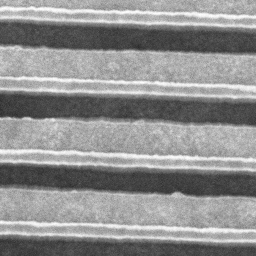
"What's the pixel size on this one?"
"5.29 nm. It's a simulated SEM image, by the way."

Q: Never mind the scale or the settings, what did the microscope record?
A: lines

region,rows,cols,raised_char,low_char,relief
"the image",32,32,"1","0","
11111111111111111111111111111111
11111111111111111111111111111111
00000011111111111111111111111111
00000000000000000000000000000000
00000000000000000000000000000000
00000000000000000000000000000000
11111111111111111110000000000000
11111111111111111111111111111111
11111111111111111111111111111111
11111111111111111111111111111111
11111111111111111111111111111111
00000000111111111111111111111111
00000000000000000000000000000000
00000000000000000000000000000000
00000000000000000000000000000000
11111111111111111111100000000000
11111111111111111111111111111111
11111111111111111111111111111111
11111111111111111111111111111111
11111111111111111111111111111111
00000001111111111111111111111111
00000000000000000000000000000000
00000000000000000000000000000000
00000000000000000000000000000000
11111111111111111111111000000000
11111111111111111111111111111111
11111111111111111111111111111111
11111111111111111111111111111111
11111111111111111111111111111111
00000000011111111111111111111111
00000000000000000000000000000000
00000000000000000000000000000000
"